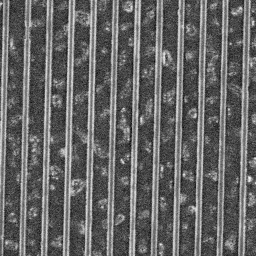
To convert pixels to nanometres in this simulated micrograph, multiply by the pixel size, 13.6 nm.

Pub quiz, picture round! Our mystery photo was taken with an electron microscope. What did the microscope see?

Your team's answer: parallel lines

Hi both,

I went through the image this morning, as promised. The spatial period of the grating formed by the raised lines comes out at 0.298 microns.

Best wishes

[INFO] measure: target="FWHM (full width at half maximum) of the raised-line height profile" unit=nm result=67.9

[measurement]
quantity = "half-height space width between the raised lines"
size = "229 nm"